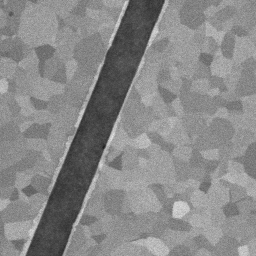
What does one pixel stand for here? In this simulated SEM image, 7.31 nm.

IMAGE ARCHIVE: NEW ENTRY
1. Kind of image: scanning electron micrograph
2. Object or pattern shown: one or a few lines or trenches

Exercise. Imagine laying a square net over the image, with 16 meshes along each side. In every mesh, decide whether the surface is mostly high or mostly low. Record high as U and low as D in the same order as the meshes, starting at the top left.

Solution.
UUUUUUUUDDUUUUUU
UUUUUUUDDDUUUUUU
UUUUUUUDDUUUUUUU
UUUUUUUDDUUUUUUU
UUUUUUDDDUUUUUUU
UUUUUUDDUUUUUUUU
UUUUUDDDUUUUUUUU
UUUUUDDUUUUUUUUU
UUUUUDDUUUUUUUUU
UUUUDDUUUUUUUUUU
UUUUDDUUUUUUUUUU
UUUDDDUUUUUUUUUU
UUUDDUUUUUUUUUUU
UUUDDUUUUUUUUUUU
UUDDUUUUUUUUUUUU
UUDDUUUUUUUUUUUU